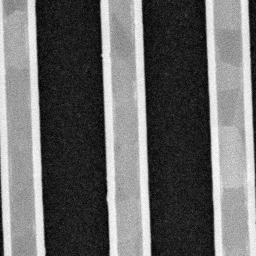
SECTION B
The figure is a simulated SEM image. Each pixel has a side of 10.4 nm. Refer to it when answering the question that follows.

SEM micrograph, one or a few lines or trenches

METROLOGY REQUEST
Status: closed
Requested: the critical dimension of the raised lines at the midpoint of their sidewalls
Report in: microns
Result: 0.342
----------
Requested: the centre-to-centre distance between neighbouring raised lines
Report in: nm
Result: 1110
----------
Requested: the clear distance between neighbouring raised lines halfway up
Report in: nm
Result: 762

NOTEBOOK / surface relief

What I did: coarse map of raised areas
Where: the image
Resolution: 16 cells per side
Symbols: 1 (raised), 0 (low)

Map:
1100000110000110
1100000110000110
1100000110000110
1100000110000110
1100000110000110
1100000110000110
1100000110000110
1100000110000111
1100000110000111
1100000110000011
1100000110000011
1100000110000011
1100000110000011
1100000110000011
1100000110000011
0110000110000011